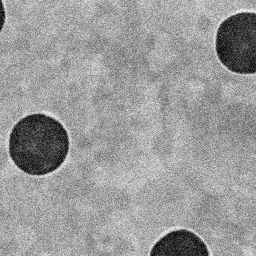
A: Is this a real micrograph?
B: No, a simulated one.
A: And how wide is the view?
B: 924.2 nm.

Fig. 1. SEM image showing holes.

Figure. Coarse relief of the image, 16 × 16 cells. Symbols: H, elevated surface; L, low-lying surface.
HHHHHHHHHHHHHHHH
HHHHHHHHHHHHHHLL
HHHHHHHHHHHHHLLL
HHHHHHHHHHHHHHLL
HHHHHHHHHHHHHHHL
HHHHHHHHHHHHHHHH
HHHHHHHHHHHHHHHH
HLLLHHHHHHHHHHHH
HLLLHHHHHHHHHHHH
HLLLHHHHHHHHHHHH
HLLLHHHHHHHHHHHH
HHHHHHHHHHHHHHHH
HHHHHHHHHHHHHHHH
HHHHHHHHHHHHHHHH
HHHHHHHHHHLLHHHH
HHHHHHHHHLLLLHHH